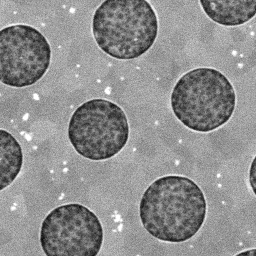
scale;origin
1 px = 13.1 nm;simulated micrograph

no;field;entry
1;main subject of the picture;holes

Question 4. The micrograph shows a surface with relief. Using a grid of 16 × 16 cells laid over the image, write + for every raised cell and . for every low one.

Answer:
++++++...++++...
++++++....++++.+
...+++....++++++
...++++..+++++++
...+++++++++..++
+++++++++++....+
+++++..++++....+
++++....+++...++
.+++....++++++++
.++++..+++++++++
.+++++++++++++++
.+++++++++..++++
+++++++++....+++
+++...+++....+++
+++...+++...++++
+++...++++++++++